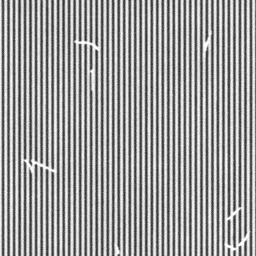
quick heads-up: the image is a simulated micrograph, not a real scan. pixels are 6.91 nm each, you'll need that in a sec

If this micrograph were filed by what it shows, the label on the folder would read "parallel lines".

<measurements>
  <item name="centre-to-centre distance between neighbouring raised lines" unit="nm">38.1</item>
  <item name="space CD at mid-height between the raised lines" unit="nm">20.7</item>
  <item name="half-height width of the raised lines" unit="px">3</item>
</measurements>